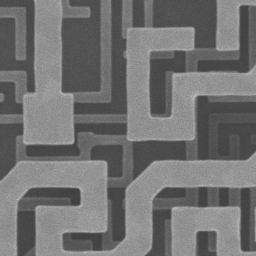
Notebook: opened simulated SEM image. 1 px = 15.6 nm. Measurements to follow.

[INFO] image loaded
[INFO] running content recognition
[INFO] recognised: wiring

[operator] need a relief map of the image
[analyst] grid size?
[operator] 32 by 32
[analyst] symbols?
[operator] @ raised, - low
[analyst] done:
----@@@@-------------------@@@@@
----@@@@-------------------@@@--
----@@@@-------------------@@@--
----@@@@-------------@@@---@@@--
----@@@@--------@@@@@@@@---@@@--
----@@@@--------@@@@@@@@---@@@--
----@@@@--------@@@-------------
----@@@@--------@@@-------------
----@@@@--------@@@-------------
----@@@@--------@@@---@@@@@@@@@@
-----@@@--------@@@---@@@@@@@@@@
----@@@@--------@@@---@@@@@@@@@@
---@@@@@@-------@@@---@@--------
---@@@@@@-------@@@---@@--------
---@@@@@@-------@@@--@@@--------
---@@@@@@-------@@@@@@@@--------
---@@@@@@-------@@@@@@@@--------
---@@@@@@-------@@@-@@@---------
--------------------------------
-------------------------------@
--@@@@@@@@@@@------@@@@@@@@@@@@@
-@@@@@@@@@@@@-----@@@@@@@@@@@@@@
@@@@@@@@@@@@@----@@@@@@@@@@@@@@@
@@@@------@@@---@@@@------------
@@@-------@@@---@@@-------------
@@--------@@@---@@@-------------
@@---@@@@@@@@---@@@---@@@@@@@@--
@@---@@@@@@@@---@@@--@@@@@@@@@--
@@---@@@@@@@@---@@@--@@@@@@@@@--
@@---@@@--------@@@---@@---@@@--
@@---@@@-------@@@@---@@---@@@--
@@---@@@@--@@@@@@@@---@@---@@@@-